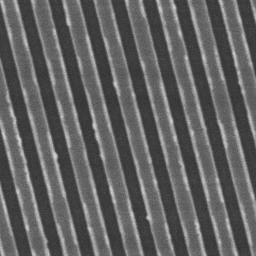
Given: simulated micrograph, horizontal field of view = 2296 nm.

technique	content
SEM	parallel lines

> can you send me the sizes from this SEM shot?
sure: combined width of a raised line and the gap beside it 273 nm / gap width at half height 128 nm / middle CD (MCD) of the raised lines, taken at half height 0.146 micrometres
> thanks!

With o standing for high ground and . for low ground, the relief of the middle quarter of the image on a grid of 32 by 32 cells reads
....oooo....oooo...oooo....oooo.
....oooo....oooo....oooo....oooo
o...ooooo...oooo....oooo....oooo
o....oooo...oooo....oooo....oooo
o....oooo...ooooo....oooo....ooo
o....oooo....oooo....oooo....ooo
oo...oooo....oooo....oooo....ooo
oo....oooo...ooooo...oooo....ooo
oo....oooo....oooo...ooooo...ooo
oo....oooo....oooo....oooo....oo
ooo...oooo....oooo....oooo....oo
ooo....oooo....oooo...oooo....oo
ooo....oooo....oooo....oooo...oo
ooo....oooo....oooo....oooo....o
ooo....oooo....oooo....oooo....o
oooo...ooooo....oooo...oooo....o
oooo....oooo....oooo...ooooo...o
oooo....oooo....oooo....oooo....
.ooo....oooo....oooo....oooo....
.oooo...ooooo....oooo...oooo....
.oooo....oooo....oooo...ooooo...
.oooo....oooo....oooo....oooo...
..oooo...oooo....oooo....oooo...
..oooo...ooooo....oooo...oooo...
..oooo....oooo....oooo...ooooo..
..oooo....oooo....oooo....oooo..
...oooo...oooo....oooo....oooo..
...oooo....oooo....ooo....oooo..
...oooo....oooo....oooo....oooo.
...oooo....oooo....oooo....oooo.
....oooo...oooo....oooo....oooo.
....oooo....oooo...oooo....oooo.